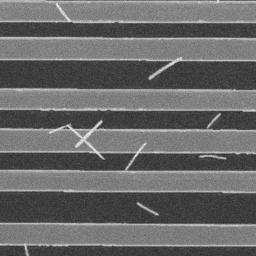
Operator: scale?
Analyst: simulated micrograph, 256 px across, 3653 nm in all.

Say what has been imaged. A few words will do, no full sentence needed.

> lines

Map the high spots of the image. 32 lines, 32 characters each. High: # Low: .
################################
################################
################################
................................
................................
################################
################################
..................##############
................................
................................
................................
################################
################################
################################
................................
................................
################################
################################
################################
................................
................................
#############################.##
################################
################################
................................
................................
................................
................................
################################
################################
################################
................................